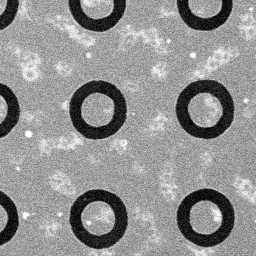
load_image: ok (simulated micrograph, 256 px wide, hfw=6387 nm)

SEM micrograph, ring-shaped grooves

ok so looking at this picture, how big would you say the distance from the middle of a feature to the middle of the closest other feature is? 107 px